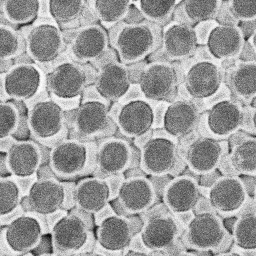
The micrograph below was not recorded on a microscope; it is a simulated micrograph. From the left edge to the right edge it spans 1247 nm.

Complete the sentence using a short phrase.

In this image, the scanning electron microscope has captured a regular array of raised bodies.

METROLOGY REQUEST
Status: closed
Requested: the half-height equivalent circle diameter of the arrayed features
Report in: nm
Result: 150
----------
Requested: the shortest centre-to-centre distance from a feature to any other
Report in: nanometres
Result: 214